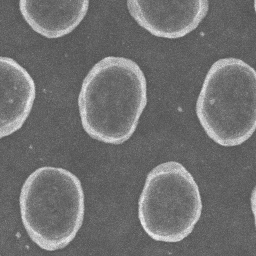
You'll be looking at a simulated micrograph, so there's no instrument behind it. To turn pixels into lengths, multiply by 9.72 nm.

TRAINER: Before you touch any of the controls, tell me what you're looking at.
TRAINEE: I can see raised bodies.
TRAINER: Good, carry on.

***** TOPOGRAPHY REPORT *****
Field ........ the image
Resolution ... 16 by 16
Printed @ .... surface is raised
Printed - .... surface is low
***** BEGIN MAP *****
-@@@@---@@@@@---
--@@@----@@@----
----------------
----------------
@-----@@@----@@@
@@---@@@@----@@@
@@---@@@@---@@@@
@----@@@@----@@@
------@@-----@@-
----------------
----------------
--@@@----@@@----
-@@@@----@@@@---
-@@@@----@@@----
--@@@----@@@----
----------------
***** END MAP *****